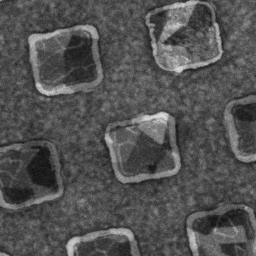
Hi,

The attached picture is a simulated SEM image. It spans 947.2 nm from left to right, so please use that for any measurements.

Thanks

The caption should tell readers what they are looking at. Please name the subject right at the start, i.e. raised bodies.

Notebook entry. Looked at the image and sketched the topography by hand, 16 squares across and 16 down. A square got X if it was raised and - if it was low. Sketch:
----------------
----------------
--XXXX----------
--XXXX----------
--XXXX----------
--XXX-----------
--------------XX
--------XXX---XX
-------XXXX---XX
XXX----XXXX----X
XXXX---XXXX-----
XXXX------------
XX--------------
------------XXXX
------XX----XXXX
----XXXX----XXXX